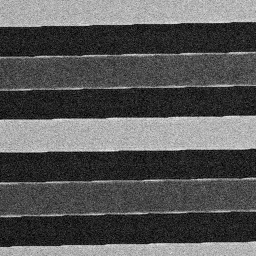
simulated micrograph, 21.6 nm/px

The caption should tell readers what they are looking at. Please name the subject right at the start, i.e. lines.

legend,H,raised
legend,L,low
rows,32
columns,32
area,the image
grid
HHHHHHHHHHHHHHHHHHHHHHHHHHHHHHHH
HHHHHHHHHHHHHHHHHHHHHHHHHHHHHHHH
HHHHHHHHHHHHHHHHHHHHHHHHHHHHHHHH
LLLLLLLLLLLLLLLLLLLLLLLLLLLLLLLL
LLLLLLLLLLLLLLLLLLLLLLLLLLLLLLLL
LLLLLLLLLLLLLLLLLLLLLLLLLLLLLLLL
LLLLLLLLLLLLLLLLLLLLLLLLLLLLLLLL
HHHHHHHHHHHHHHHHHHHHHHHHHHHHHHHH
HHHHHHHHHHHHHHHHHHHHHHHHHHHHHHHH
HHHHHHHHHHHHHHHHHHHHHHHHHHHHHHHH
HHHHHHHHHHHHHHHHHHHHHHHHHHHHHHHH
LLLLLLLLLLLLLLLLLLLLLLLLLLLLLLLL
LLLLLLLLLLLLLLLLLLLLLLLLLLLLLLLL
LLLLLLLLLLLLLLLLLLLLLLLLLLLLLLLL
LLLLLLLLLLLLLLLLLLLLLLLLLLLLLLLL
HHHHHHHHHHHHHHHHHHHHHHHHHHHHHHHH
HHHHHHHHHHHHHHHHHHHHHHHHHHHHHHHH
HHHHHHHHHHHHHHHHHHHHHHHHHHHHHHHH
HHHHHHHHHHHHHHHHHHHHHHHHHHHHHHHL
LLLLLLLLLLLLLLLLLLLLLLLLLLLLLLLL
LLLLLLLLLLLLLLLLLLLLLLLLLLLLLLLL
LLLLLLLLLLLLLLLLLLLLLLLLLLLLLLLL
LLLLLLLLLLLLLLLLLLLLLLLLHHHHHHHH
HHHHHHHHHHHHHHHHHHHHHHHHHHHHHHHH
HHHHHHHHHHHHHHHHHHHHHHHHHHHHHHHH
HHHHHHHHHHHHHHHHHHHHHHHHHHHHHHHH
HHHHHHHHHHHHHHHHHHHHHHHLLLLLLLLL
LLLLLLLLLLLLLLLLLLLLLLLLLLLLLLLL
LLLLLLLLLLLLLLLLLLLLLLLLLLLLLLLL
LLLLLLLLLLLLLLLLLLLLLLLLLLLLLLLL
LLLLLLLLLLLLLLLLLLLLLLLLLHHHHHHH
HHHHHHHHHHHHHHHHHHHHHHHHHHHHHHHH